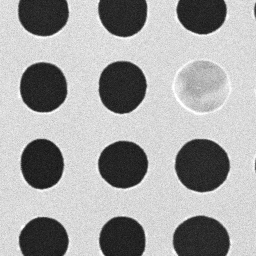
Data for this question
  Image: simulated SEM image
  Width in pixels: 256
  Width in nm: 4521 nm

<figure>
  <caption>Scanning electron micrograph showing holes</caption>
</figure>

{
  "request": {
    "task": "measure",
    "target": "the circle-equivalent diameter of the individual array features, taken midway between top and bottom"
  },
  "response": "0.877 µm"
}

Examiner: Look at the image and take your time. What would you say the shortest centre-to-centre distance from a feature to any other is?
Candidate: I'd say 1.36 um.